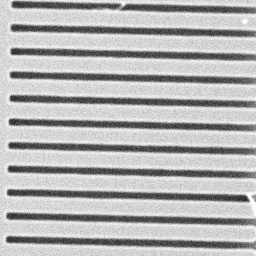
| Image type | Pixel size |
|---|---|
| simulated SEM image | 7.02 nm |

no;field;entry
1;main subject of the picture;groups of lines, slits or small figures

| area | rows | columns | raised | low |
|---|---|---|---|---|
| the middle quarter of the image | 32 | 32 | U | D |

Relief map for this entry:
UUUUUUUUUUUUUUUUUUUUUUUUUUUUUUUU
UUUUUUUUUUUUUUUUUUUUUUUUUUUUUUUU
DDDDDDDDDDDDDDDDDDDUUUUUUUUUUUUU
DDDDDDDDDDDDDDDDDDDDDDDDDDDDDDDD
UUUUUUUUUUDDDDDDDDDDDDDDDDDDDDDD
UUUUUUUUUUUUUUUUUUUUUUUUUUUUUUUU
UUUUUUUUUUUUUUUUUUUUUUUUUUUUUUUU
UUUUUUUUUUUUUUUUUUUUUUUUUUUUUUUU
DDDDDDDDDDDDDDDDDDDDDDDDDUUUUUUU
DDDDDDDDDDDDDDDDDDDDDDDDDDDDDDDD
UUUUUUUUUUUUUUUUDDDDDDDDDDDDDDDD
UUUUUUUUUUUUUUUUUUUUUUUUUUUUUUUU
UUUUUUUUUUUUUUUUUUUUUUUUUUUUUUUU
UUUUUUUUUUUUUUUUUUUUUUUUUUUUUUUU
DDDDDDDDDDDDDDDDDDDDDDDDDDDDDDDU
DDDDDDDDDDDDDDDDDDDDDDDDDDDDDDDD
UUUUUUUUUUUUUUUUUUUUUUDDDDDDDDDD
UUUUUUUUUUUUUUUUUUUUUUUUUUUUUUUU
UUUUUUUUUUUUUUUUUUUUUUUUUUUUUUUU
DUUUUUUUUUUUUUUUUUUUUUUUUUUUUUUU
DDDDDDDDDDDDDDDDDDDDDDDDDDDDDDDD
DDDDDDDDDDDDDDDDDDDDDDDDDDDDDDDD
UUUUUUUUUUUUUUUUUUUUUUUUUUDDDDDD
UUUUUUUUUUUUUUUUUUUUUUUUUUUUUUUU
UUUUUUUUUUUUUUUUUUUUUUUUUUUUUUUU
DDDDDDDUUUUUUUUUUUUUUUUUUUUUUUUU
DDDDDDDDDDDDDDDDDDDDDDDDDDDDDDDD
DDDDDDDDDDDDDDDDDDDDDDDDDDDDDDDD
UUUUUUUUUUUUUUUUUUUUUUUUUUUUUUUU
UUUUUUUUUUUUUUUUUUUUUUUUUUUUUUUU
UUUUUUUUUUUUUUUUUUUUUUUUUUUUUUUU
DDUUUUUUUUUUUUUUUUUUUUUUUUUUUUUU